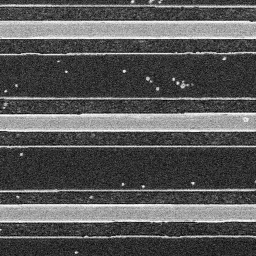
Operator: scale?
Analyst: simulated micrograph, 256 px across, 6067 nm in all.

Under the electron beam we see lines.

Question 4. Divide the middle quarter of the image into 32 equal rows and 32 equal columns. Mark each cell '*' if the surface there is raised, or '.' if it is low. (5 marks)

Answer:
********************************
********************************
********************************
********************************
********************************
********************************
********************************
********************************
********************************
................................
................................
................................
................................
********************************
********************************
********************************
*********..................*****
................................
................................
................................
................................
********************************
********************************
********************************
********************************
********************************
********************************
********************************
********************************
********************************
********************************
********************************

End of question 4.